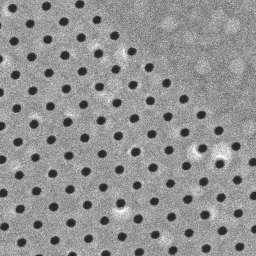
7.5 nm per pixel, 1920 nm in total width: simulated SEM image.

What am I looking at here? a regular array of holes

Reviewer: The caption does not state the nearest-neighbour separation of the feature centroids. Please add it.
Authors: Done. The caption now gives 175 nm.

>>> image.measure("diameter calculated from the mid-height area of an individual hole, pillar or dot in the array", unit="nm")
70.8